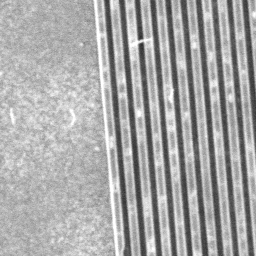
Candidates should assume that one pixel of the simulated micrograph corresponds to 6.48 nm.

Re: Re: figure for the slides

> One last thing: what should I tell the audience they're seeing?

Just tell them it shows parallel lines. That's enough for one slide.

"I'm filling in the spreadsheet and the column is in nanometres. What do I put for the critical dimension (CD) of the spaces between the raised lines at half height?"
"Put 42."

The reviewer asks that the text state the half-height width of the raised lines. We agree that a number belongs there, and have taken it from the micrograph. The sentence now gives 53.3 nanometers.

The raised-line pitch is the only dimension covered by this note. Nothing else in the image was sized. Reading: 15.3 pixels